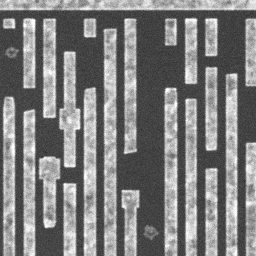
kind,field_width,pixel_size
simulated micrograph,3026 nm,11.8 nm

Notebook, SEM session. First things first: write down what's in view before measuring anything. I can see wiring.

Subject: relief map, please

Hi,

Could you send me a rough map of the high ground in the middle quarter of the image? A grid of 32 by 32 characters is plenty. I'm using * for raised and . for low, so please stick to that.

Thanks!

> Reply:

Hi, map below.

***.......***..***.............*
***.......***..***.............*
***.......***..***.............*
***.......***..***.............*
***.......***..***.............*
***.......***..***..............
***...**..***..***........**....
***..***..***..***.......***....
***..***..***..***.......***....
***..***..***..***.......***...*
***..***..***..***.......**....*
****.***..***..***.......***...*
****.***..***..***.......***...*
****.***..***..***.......***...*
****.***..***..***.......***...*
****.***..***..***.......***...*
***..***..***..***.......***...*
***..***..***..***.......***...*
***..***..***..***.......***...*
***..***..***..***.......***...*
***..***..***..***.......***...*
***..***..***..***.......***...*
***..***..***............***...*
***..***..***............***...*
***..***..***............***...*
***..***..***............***...*
.....***..***............***...*
.....***..***............***...*
.....***..***............***...*
.....***..***............***...*
***..***..***............***...*
***..***..***............***...*